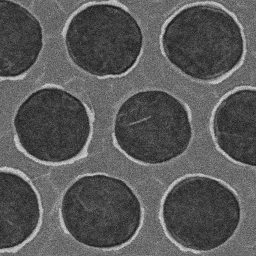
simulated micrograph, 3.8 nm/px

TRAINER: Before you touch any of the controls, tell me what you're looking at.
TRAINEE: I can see holes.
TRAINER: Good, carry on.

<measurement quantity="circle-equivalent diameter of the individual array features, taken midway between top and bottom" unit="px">75.2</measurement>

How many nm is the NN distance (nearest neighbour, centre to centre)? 376